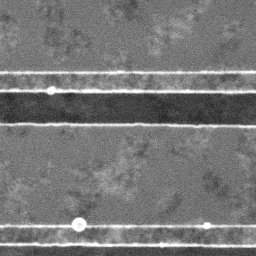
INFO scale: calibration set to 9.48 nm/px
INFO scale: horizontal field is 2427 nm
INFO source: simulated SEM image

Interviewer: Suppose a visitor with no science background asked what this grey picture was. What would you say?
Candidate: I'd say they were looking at lines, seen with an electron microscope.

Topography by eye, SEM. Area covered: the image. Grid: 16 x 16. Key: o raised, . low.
oooooooooooooooo
oooooooooooooooo
oooooooooooooooo
oooooooooooooooo
oooooooooooooooo
oooooooooooooooo
................
................
oooooooooooooooo
oooooooooooooooo
oooooooooooooooo
oooooooooooooooo
oooooooooooooooo
oooooooooooooooo
oooooooooooooooo
................